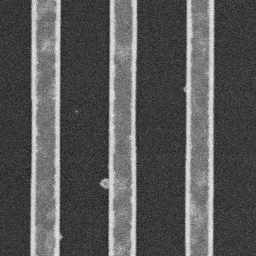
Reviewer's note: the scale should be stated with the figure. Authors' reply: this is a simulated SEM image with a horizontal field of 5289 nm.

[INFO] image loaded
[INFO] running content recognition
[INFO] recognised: one or a few lines or trenches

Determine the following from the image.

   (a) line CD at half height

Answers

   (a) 478 nm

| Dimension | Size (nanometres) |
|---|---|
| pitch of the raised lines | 1590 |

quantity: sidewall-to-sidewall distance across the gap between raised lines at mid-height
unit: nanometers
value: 1120